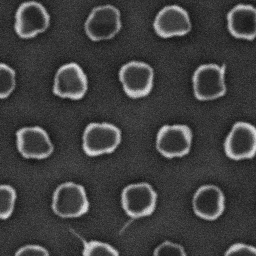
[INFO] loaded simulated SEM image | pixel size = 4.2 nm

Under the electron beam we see a regular array of raised bodies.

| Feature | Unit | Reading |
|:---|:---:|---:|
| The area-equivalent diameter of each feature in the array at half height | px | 32.1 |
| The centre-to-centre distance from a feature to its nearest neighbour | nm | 282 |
